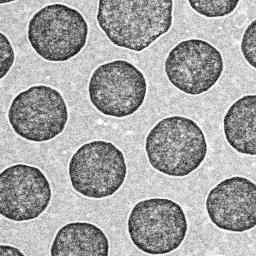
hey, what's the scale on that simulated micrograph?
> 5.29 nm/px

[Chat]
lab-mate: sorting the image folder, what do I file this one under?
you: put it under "holes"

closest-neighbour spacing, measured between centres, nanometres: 430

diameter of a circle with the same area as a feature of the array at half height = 305 nm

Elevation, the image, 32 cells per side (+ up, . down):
++++++++++++..........++......++
+++++.....++..........+++....+++
++++.......+..........++++++++++
+++........++........++++++++++.
.+++.......++.......++++++++++..
.+++.......+++.....+++....++++..
..+++.....+++++++++++......+++..
..++++..+++++++++++++.......+++.
.+++++++++++.....++++.......++++
.++++++++++.......+++.......++++
+++++++++++.......++++.....+++++
+++....++++.......+++++..+++++++
++......+++.......++++++++++++..
+.......++++.....++++++++++++...
+.......++++++..++++++++++++....
+.......++++++++++++.....+++....
++......+++++++++++......+++....
+++...++++++++++++........++....
++++++++++.....+++........+++...
+++++++++......+++........++++++
+++++++++.......+++......+++++++
.....++++.......++++....++++++++
......+++.......++++++++++++...+
......+++......++++++++++++.....
......+++++...++++++++++++......
......+++++++++++.....++++......
.....+++++++++++.......+++......
+..+++++++++++++.......+++......
++++++++....++++.......+++++...+
+++++++......+++.......+++++++++
+++++++.......+++......+++++++++
...+++........++++...+++++++++++